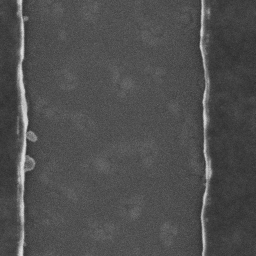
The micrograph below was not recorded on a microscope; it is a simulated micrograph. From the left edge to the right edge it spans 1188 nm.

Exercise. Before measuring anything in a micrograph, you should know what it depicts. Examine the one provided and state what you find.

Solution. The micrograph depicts one or a few lines or trenches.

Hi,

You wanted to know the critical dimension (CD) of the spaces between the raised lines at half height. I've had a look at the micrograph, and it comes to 837 nm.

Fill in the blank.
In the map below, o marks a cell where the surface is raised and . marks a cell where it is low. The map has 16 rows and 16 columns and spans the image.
o............ooo
o............ooo
o............ooo
o............ooo
o............ooo
o............ooo
oo...........ooo
oo...........ooo
oo...........ooo
o............ooo
o............ooo
o............ooo
o............ooo
o............ooo
o............ooo
o............ooo